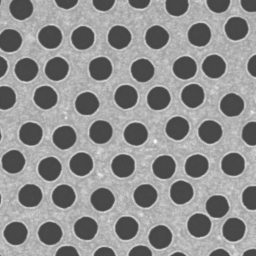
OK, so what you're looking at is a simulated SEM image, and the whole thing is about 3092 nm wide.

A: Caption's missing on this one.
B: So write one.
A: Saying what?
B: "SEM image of a regular array of holes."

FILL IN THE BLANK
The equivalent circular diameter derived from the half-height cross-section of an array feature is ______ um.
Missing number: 0.287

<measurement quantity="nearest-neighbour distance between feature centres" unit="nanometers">394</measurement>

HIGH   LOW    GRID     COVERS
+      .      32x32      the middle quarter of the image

.+++++......+++++.....+++++.....
.+++++......+++++......++++.....
.++++++.....+++++.....++++++....
+++++++....++++++.....+++++++...
+++++++++++++++++++.++++++++++++
++++++++++++++...++++++.+++++++.
+++++++++++++.....++++....++++..
++++....+++++.....+++.....+++...
+++.....+++++.....+++......++...
+++......++++.....+++......+++..
+++......++++....++++.....+++++.
+++.....+++++++++++++++.++++++++
++++...+++++++++++++++++++++++++
+++++++++++++++++++++++++++...++
++++++++...+++++++++++++++.....+
.++++++.....++++....+++++......+
...+++......+++......++++......+
...+++......+++......+++++.....+
...++++.....+++......++++++...++
...++++....+++++....++++++++++++
..++++++++++++++++++++++++++++++
++++++++++++++++++++++++++++++++
+++...++++++++++++++++++++++++++
++.....++++++....++++++....++++.
+......+++++......++++......++..
+......+++++......++++......++..
++.....+++++......++++......++..
+++...+++++++....++++++.....+++.
++++++++++++++.+++++++++..++++++
++++++++++++++++++++++++++++...+
..+++++++++++++++++...+++++.....
..++++++...+++++++.....++++.....